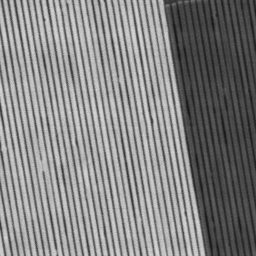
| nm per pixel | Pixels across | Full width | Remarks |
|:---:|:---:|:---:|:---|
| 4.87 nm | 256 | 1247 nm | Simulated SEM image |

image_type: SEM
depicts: parallel lines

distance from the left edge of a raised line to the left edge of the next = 31.1 nanometres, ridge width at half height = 18.7 nm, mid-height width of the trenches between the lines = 13.2 nm